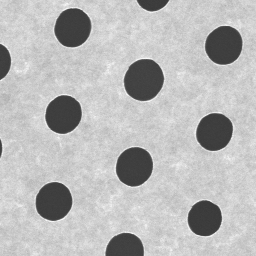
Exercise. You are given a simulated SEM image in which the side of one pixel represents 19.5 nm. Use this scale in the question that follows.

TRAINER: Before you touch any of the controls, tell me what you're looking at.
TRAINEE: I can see a regular array of holes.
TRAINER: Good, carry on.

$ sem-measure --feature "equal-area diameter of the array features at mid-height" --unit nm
736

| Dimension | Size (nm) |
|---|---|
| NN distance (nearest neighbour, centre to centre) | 1700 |